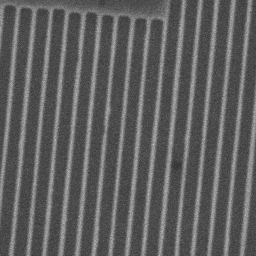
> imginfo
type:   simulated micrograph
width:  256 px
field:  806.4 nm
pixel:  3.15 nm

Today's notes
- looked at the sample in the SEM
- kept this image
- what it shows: parallel lines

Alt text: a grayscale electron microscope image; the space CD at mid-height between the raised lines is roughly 39.6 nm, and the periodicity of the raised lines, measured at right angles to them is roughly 51.7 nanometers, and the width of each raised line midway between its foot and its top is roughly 11.4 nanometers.